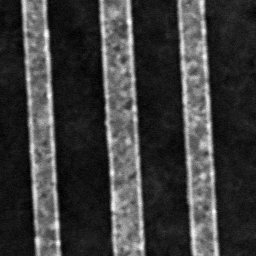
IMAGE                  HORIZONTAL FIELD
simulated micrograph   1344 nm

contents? one or a few lines or trenches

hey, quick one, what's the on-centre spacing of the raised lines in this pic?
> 410 nm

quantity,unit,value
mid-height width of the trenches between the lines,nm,287